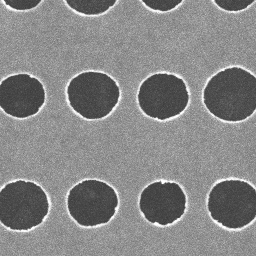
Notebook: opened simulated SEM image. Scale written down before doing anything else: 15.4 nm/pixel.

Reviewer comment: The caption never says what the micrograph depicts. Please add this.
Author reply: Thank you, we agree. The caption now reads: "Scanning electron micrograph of holes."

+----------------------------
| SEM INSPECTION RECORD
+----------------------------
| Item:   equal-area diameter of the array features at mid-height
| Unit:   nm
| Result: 747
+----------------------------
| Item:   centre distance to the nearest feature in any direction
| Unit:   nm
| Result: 1080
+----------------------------